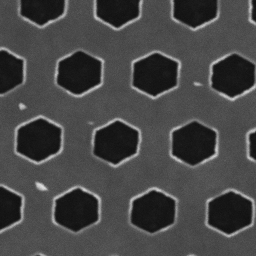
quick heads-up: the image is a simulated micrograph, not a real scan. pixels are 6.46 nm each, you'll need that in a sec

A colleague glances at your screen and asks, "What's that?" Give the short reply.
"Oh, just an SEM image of a regular array of holes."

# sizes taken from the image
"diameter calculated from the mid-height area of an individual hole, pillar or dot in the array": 275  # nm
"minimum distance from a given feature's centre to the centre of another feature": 76.7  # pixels